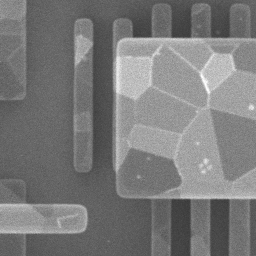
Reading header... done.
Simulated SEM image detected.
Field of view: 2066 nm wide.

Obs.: wiring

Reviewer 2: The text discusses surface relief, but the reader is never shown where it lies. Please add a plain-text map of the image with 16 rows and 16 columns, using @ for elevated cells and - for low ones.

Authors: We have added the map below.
----------------
----------------
--------@@@@@@@@
-------@@@@@@@@@
-------@@@@@@@@@
-------@@@@@@@@@
-------@@@@@@@@@
-------@@@@@@@@@
-------@@@@@@@@@
-------@@@@@@@@@
-------@@@@@@@@@
-------@@@@@@@@@
----------------
@@@@@-----------
@@@@@-----------
----------------